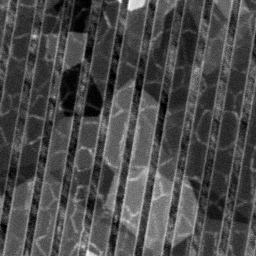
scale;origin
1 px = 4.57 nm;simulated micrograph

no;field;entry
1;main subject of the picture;parallel lines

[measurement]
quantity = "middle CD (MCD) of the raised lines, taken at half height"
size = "85.6 nm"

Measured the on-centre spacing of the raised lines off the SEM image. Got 125 nanometres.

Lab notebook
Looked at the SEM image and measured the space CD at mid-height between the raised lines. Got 0.04 microns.